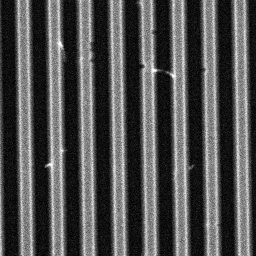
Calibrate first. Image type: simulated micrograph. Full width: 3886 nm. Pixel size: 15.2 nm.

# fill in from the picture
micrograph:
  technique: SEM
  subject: parallel lines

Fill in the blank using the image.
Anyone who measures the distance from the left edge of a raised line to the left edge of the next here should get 470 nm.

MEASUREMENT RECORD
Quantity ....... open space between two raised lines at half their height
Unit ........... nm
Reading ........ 283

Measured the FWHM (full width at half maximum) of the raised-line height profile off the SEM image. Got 194 nm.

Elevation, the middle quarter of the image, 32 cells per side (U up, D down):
DDDDUUUDDDDDUUUDDDDDUUUDDDDUUUDD
DDDDUUUDDDDDUUUDDDDDUUUDDDDUUUDD
DDDDUUUDDDDDUUUDDDDDUUUDDDDUUUDD
DDDDUUUDDDDDUUUDDDDDUUUDDDDUUUDD
DDDDUUUDDDDDUUUDDDDDUUUDDDDUUUDD
DDDDUUUDDDDDUUUDDDDDUUUDDDDUUUDD
DDDDUUUDDDDDUUUDDDDDUUUDDDDUUUDD
DDDDUUUDDDDDUUUDDDDDUUUDDDDUUUDD
DDDDUUUDDDDDUUUDDDDDUUUDDDDUUUDD
DDDDUUUDDDDDUUUDDDDDUUUDDDDUUUDD
DDDDUUUDDDDDUUUDDDDDUUUDDDDUUUDD
DDDDUUUDDDDDUUUDDDDDUUUDDDDUUUDD
DDDDUUUDDDDDUUUDDDDDUUUDDDDUUUDD
DDDDUUUDDDDDUUUDDDDDUUUDDDDUUUDD
DDDDUUUDDDDDUUUDDDDDUUUDDDDUUUDD
DDDDUUUDDDDDUUUDDDDDUUUDDDDUUUDD
DDDDUUUDDDDDUUUDDDDDUUUDDDDDUUDD
DDDDUUUDDDDDUUUDDDDDUUUDDDDDUUDD
DDDDUUUDDDDDUUUDDDDDUUUDDDDDUUDD
DDDDUUUDDDDDUUUDDDDDUUUDDDDDUUUD
DDDDUUUDDDDDUUUDDDDDUUUDDDDDUUUD
DDDDUUUDDDDDUUUDDDDDUUUDDDDDUUUD
DDDDUUUDDDDDUUUDDDDDUUUDDDDDUUUD
DDDDUUUDDDDDUUUDDDDDUUUDDDDDUUUD
DDDDUUUDDDDDUUUDDDDDUUUDDDDDUUUD
DDDDDUUDDDDDUUUDDDDDUUUDDDDDUUUD
DDDDDUUDDDDDUUUDDDDDUUUDDDDDUUUD
DDDDDUUDDDDDUUUDDDDDUUUDDDDUUUUD
DDDDDUUUDDDDUUUDDDDDUUUDDDDUUUUD
DDDDDUUUDDDDUUUDDDDDUUUDDDDDUUUD
DDDDDUUUDDDDUUUDDDDDUUUDDDDDUUUD
DDDDDUUUDDDDUUUDDDDDUUUDDDDDUUUD